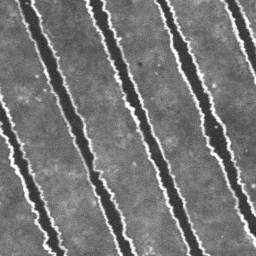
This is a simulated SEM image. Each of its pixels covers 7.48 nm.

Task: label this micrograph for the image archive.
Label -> one or a few lines or trenches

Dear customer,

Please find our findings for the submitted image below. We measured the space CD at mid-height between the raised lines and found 369 nm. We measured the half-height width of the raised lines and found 102 nanometers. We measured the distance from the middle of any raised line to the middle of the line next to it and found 477 nm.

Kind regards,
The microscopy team